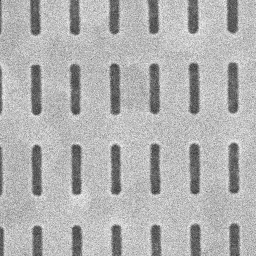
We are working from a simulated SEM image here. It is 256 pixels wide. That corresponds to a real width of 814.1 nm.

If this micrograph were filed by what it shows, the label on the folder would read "a regular array of holes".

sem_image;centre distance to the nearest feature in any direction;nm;124